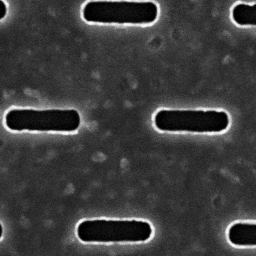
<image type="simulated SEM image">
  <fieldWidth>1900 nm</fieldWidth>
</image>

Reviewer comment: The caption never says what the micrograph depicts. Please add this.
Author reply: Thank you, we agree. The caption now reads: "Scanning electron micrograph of holes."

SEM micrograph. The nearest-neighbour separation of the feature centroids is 971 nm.